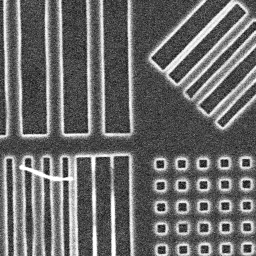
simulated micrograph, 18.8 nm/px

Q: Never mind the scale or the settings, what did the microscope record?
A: groups of lines, slits or small figures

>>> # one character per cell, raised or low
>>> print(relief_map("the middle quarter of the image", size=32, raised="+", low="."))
......++++......+++++++...++....
......++++......+++++++++++.....
......++++......++++++++++.....+
......++++......+++++++++++...++
......++++......++++++++++++.+++
......++++......+++++++++++++++.
......++++.......+++++++++++++..
......++++.......+++++++++++++..
......++++.......++++++++++++++.
......++++.......+++++++++++++++
......++++.......+++++++++++++++
......++++.......+++++++++++++++
......++++.......+++++++++++++++
......++++.......+++++++++++++++
......++++.......+++++++++++++++
......++++.......+++++++++++++++
......++++.......+++++++++++++++
......++++......++++++++++++++++
++++++++++++++++++++++++++++++++
++++++++++++++++++++++++++++++++
++++++++++++++++++++++++++++++++
++++++++++++++++++++++++++++++++
++++++++++++++++++++++++++++++++
.++....+.........+++++++++++++++
.++..............++++++..+++...+
.++..............++++++..+++...+
.++..............+++++++++++++++
.++..............+++++++++++++++
.++..............+++++++++++++++
.++..............++++++..++++.++
.++..............++++++..+++...+
.++..............+++++++.++++.++